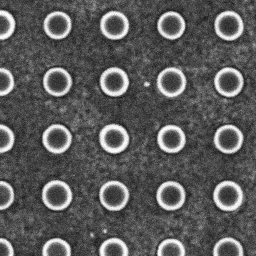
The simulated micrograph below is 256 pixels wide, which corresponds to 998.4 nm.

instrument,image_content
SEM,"a regular array of raised bodies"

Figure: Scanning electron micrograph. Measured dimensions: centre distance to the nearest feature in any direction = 0.221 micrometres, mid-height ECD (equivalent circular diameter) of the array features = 102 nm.